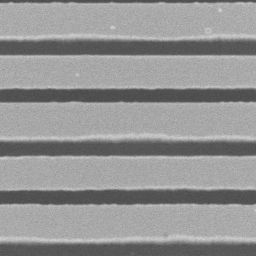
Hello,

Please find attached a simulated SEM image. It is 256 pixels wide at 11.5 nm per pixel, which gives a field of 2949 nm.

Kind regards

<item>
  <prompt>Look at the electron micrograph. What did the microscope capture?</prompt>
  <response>lines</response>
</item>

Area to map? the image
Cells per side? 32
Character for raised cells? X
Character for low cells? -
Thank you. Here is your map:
XXXXXXXXXXXXXXXXXXXXXXXXXXXXXXXX
XXXXXXXXXXXXXXXXXXXXXXXXXXXXXXXX
XXXXXXXXXXXXXXXXXXXXXXXXXXXXXXXX
XXXXXXXXXXXXXXXXXXXXXXXXXXXXXXXX
XXXXXXXXXXXXXXXXXXXXXXXXXXXXXXXX
--------------------------------
--------------------------------
XXXXXXXXXXXXXXXXXXXXXXXXXXXXXXXX
XXXXXXXXXXXXXXXXXXXXXXXXXXXXXXXX
XXXXXXXXXXXXXXXXXXXXXXXXXXXXXXXX
XXXXXXXXXXXXXXXXXXXXXXXXXXXXXXXX
--------------------------------
--------------------------------
XXXXXXXXXXXXXXXXXXXXXXXXXXXXXXXX
XXXXXXXXXXXXXXXXXXXXXXXXXXXXXXXX
XXXXXXXXXXXXXXXXXXXXXXXXXXXXXXXX
XXXXXXXXXXXXXXXXXXXXXXXXXXXXXXXX
XXXXXXXXXXXXXXXXXXXXXXXXXXXXXXXX
--------------------------------
--------------------------------
XXXXXXXXXXXXXXXXXXXXXXXXXXXXXXXX
XXXXXXXXXXXXXXXXXXXXXXXXXXXXXXXX
XXXXXXXXXXXXXXXXXXXXXXXXXXXXXXXX
XXXXXXXXXXXXXXXXXXXXXXXXXXXXXXXX
--------------------------------
--------------------------------
XXXXXXXXXXXXXXXXXXXXXXXXXXXXXXXX
XXXXXXXXXXXXXXXXXXXXXXXXXXXXXXXX
XXXXXXXXXXXXXXXXXXXXXXXXXXXXXXXX
XXXXXXXXXXXXXXXXXXXXXXXXXXXXXXXX
--------------------------------
--------------------------------